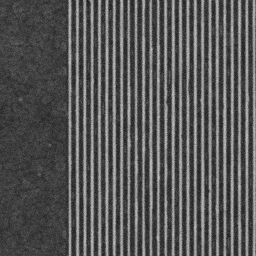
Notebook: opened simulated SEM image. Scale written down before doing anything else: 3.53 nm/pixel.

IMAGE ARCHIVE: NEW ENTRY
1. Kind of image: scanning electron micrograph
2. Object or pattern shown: parallel lines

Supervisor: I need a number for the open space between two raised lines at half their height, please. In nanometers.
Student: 16.3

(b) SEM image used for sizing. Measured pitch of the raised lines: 26 nanometers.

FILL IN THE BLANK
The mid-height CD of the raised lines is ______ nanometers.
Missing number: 9.7